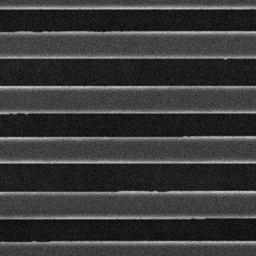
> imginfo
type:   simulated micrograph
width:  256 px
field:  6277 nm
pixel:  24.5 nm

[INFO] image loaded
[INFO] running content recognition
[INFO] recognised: lines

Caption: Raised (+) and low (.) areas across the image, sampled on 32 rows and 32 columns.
++++++++++++++++++++++++++++++++
................................
................................
................................
++++++++++++++++++++++++++++++++
++++++++++++++++++++++++++++++++
++++++++++++++++++++++++++++++++
................................
................................
................................
................................
++++++++++++++++++++++++++++++++
++++++++++++++++++++++++++++++++
++++++++++++++++++++++++++++++++
................................
................................
................................
++++++++++++++++++++++++++++++++
++++++++++++++++++++++++++++++++
++++++++++++++++++++++++++++++++
................................
................................
................................
................................
++++++++++++++++++++++++++++++++
++++++++++++++++++++++++++++++++
++++++++++++++++++++++++++++++++
................................
................................
................................
++++++++++++++++++++++++++++++++
++++++++++++++++++++++++++++++++